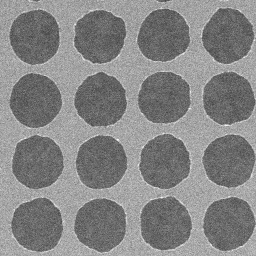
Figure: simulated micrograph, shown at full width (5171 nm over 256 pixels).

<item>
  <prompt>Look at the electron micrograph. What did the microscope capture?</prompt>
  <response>a regular array of raised bodies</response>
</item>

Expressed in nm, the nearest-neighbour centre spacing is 1250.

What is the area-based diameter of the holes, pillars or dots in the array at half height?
1.09 um